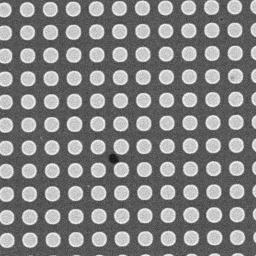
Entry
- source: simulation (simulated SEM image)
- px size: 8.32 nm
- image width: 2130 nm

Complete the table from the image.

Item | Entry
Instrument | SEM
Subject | an array of small figures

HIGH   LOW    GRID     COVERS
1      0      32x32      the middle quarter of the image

00000000000000000000000000000000
00000000000000000000000000000000
01110001110001110011110011100011
01110001110011110011110011100011
01110001110001110011100011100011
00000000000000000000000000000000
00000000000000000000000000000000
00000000000001100001100001100011
01110001110011110011110011100011
01110001110011110011110011100011
01110001110001100001100011100001
00000000000000000000000000000000
00000000000000000000000000000000
00110000110001100001100011100011
01110001110001110011110011100011
01110001110001110011110011100011
01110001100001100001100000000000
00000000000000000000000000000000
00000000000000000000000000000000
00110001110001110001110011100011
01110001110001110011110011100011
01110001110001110011110011100011
00100000000000100000000000000000
00000000000000000000000000000000
00000000000000000000000000000000
00110001110001110001110011110011
01111001110001110011110011110011
01110001110001110001110011100011
00000000000000000000000000000000
00000000000000000000000000000000
00000000000000000001100001100001
01111001110001110011110011110011